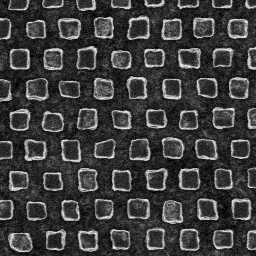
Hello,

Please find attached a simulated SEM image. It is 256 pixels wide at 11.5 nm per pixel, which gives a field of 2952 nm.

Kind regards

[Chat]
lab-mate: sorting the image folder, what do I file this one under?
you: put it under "a regular array of raised bodies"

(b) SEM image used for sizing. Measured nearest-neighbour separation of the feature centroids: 382 nm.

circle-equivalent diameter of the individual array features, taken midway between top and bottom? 240 nm